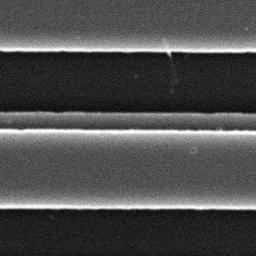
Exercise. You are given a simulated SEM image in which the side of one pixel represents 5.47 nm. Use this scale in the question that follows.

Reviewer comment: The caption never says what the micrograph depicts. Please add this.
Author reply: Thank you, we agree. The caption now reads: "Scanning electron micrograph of lines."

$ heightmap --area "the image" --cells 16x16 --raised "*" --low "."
****************
****************
****************
................
................
................
................
................
****************
****************
****************
****************
****************
................
................
................